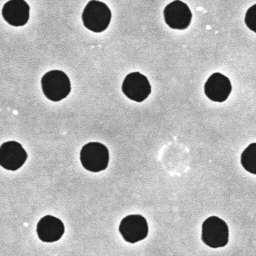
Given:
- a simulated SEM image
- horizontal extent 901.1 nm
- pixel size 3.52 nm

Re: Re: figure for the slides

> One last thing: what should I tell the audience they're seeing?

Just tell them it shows holes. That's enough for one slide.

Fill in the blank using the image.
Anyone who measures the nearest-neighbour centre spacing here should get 286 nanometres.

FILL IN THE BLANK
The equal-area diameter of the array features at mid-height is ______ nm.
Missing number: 104